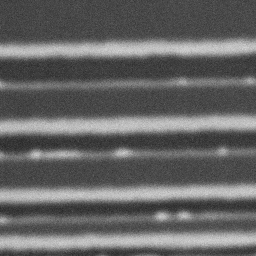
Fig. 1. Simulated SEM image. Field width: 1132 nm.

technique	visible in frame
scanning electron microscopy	lines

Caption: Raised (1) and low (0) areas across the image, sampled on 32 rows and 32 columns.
11111111111111111111111111111111
11111111111111111111111111111111
11111111111111111111111111111111
11111111111111111111111111111111
11111111111111111111111111111111
11111111111111111111111111111111
11111111111111111111111111111110
00000000000000000000000000000000
00000000000000000000000000000000
00000000000000000000000000000000
00000000110011111111111111111111
11111111111111111111111111111111
11111111111111111111111111111111
11111111111111111111111111111111
11111111111111111111111111111111
11111111111111111111111111111111
11110000100000000000000000000000
00000000000000000000000000000000
00000000000000000000000000000000
10011111111111111111111111111111
11111111111111111111111111111111
11111111111111111111111111111111
11111111111111111111111111111111
11111111111111111111111111111111
11111111111111111111111111111111
00000000000000000000000000000000
00000000000000000000000000000000
11111111111111111111111111111111
11111111111111111111111111111111
11111111111111111111111111111111
11111111111111111111111111111110
00000000000000000000000000000000